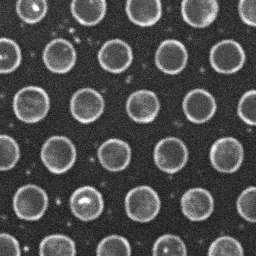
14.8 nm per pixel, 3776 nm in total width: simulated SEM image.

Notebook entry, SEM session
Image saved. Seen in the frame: a regular array of raised bodies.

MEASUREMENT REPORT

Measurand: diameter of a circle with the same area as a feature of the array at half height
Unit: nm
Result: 476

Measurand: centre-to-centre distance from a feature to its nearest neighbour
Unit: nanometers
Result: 821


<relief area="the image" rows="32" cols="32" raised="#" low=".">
..####...####...####...####...##
..####...####...####...####...##
...##.....##.....###...####....#
................................
................................
##....###....###....##.....###..
##....###...####....###....###..
##....###...####....###...####..
##....###....###....###....###..
................................
................................
...##.....##.....##.....##......
..####...####...####...####...##
..####...####...####...####...##
..###....###....###....###....##
...............................#
................................
##....##......#......#......#...
##...####....###....###....###..
##...####...####...####...####..
##....###....###....###....###..
.......#.............#..........
................................
...##............##.............
..####...###....####...###....##
..####...####...####...###....##
..###....####...####...###....##
.................##............#
................................
#....................#..........
##...####....###...####....###..
##...####...####...####...####..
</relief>